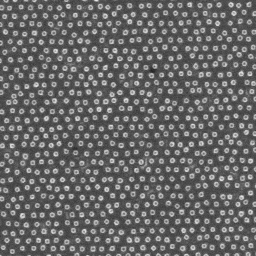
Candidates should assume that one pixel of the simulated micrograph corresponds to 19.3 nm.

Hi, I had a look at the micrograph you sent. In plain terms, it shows a regular array of raised bodies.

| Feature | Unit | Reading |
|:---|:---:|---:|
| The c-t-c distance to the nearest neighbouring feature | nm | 163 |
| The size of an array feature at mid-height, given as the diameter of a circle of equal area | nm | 87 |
